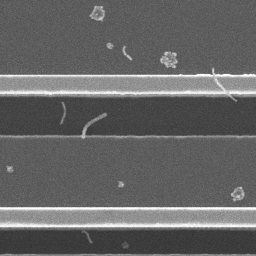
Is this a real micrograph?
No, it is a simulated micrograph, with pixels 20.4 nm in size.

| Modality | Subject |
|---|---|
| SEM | lines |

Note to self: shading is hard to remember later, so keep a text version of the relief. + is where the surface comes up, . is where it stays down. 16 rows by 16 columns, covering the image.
++++++++++++++++
++++++++++++++++
++++++++++++++++
++++++++++++++++
++++++++++++++++
++++++++++++++++
................
................
.....+..........
++++++++++++++++
++++++++++++++++
++++++++++++++++
++++++++++++++++
++++++++++++++++
................
................